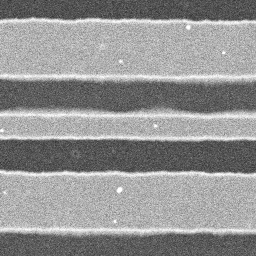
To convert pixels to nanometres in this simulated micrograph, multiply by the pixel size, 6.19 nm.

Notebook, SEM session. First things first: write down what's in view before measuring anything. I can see lines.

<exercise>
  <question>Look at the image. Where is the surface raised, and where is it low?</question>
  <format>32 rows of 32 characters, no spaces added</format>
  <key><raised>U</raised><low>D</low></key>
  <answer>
DDDDDDDDDDDDDDDDDDDDDDDDDDDDDDDD
DDDDDDDDDDDDDDDDDDDDDDDDDDDDDDDD
DDDUUUDDDDDUUDDDDDDDDDDDDDDDDDDD
UUUUUUUUUUUUUUUUUUUUUUUUUUUUUUUU
UUUUUUUUUUUUUUUUUUUUUUUUUUUUUUUU
UUUUUUUUUUUUUUUUUUUUUUUUUUUUUUUU
UUUUUUUUUUUUUUUUUUUUUUUUUUUUUUUU
UUUUUUUUUUUUUUUUUUUUUUUUUUUUUUUU
UUUUUUUUUUUUUUUUUUUUUUUUUUUUUUUU
UUUUUUUUUUUUUUUUUUUUUUUUUUUUUUUU
DDDDDDDDDDDDDDDDDDDDDDDDDDDDDDDD
DDDDDDDDDDDDDDDDDDDDDDDDDDDDDDDD
DDDDDDDDDDDDDDDDDDDDDDDDDDDDDDDD
DDDDDDDDDDDDDDDDDDDDDDDDDDDDDDDD
UUUUUUUUUUUUUUUUUUUUUUUUUDDUUUUU
UUUUUUUUUUUUUUUUUUUUUUUUUUUUUUUU
UUUUUUUUUUUUUUUUUUUUUUUUUUUUUUUU
DDDDDDDDDDDDDDDDDDDDDDDDDDDDDDDD
DDDDDDDDDDDDDDDDDDDDDDDDDDDDDDDD
DDDDDDDDDDDDDDDDDDDDDDDDDDDDDDDD
DDDDDDDDDDDDDDDDDDDDDDDDDDDDDDDD
UUUDDDDDDDDDDDUDDDDDUDDUUDDDDDDD
UUUUUUUUUUUUUUUUUUUUUUUUUUUUUUUU
UUUUUUUUUUUUUUUUUUUUUUUUUUUUUUUU
UUUUUUUUUUUUUUUUUUUUUUUUUUUUUUUU
UUUUUUUUUUUUUUUUUUUUUUUUUUUUUUUU
UUUUUUUUUUUUUUUUUUUUUUUUUUUUUUUU
UUUUUUUUUUUUUUUUUUUUUUUUUUUUUUUU
UUUUUUUUUUUUUUUUUUUUUUUUUUUUUUUU
DDDDDDDDDDDDDDDDDDDDDDDDDDDDDDDD
DDDDDDDDDDDDDDDDDDDDDDDDDDDDDDDD
DDDDDDDDDDDDDDDDDDDDDDDDDDDDDDDD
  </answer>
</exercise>